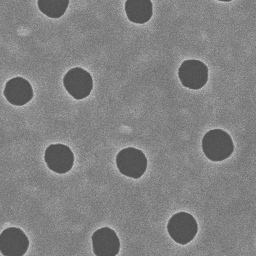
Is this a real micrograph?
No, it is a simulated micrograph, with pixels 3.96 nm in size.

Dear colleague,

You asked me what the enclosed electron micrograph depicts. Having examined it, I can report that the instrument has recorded holes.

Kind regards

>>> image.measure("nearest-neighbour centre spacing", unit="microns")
0.287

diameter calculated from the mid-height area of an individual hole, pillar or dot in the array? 0.119 µm